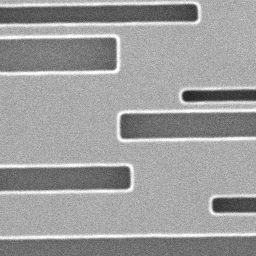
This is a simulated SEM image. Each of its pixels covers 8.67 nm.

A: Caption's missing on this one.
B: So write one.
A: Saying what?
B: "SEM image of groups of lines, slits or small figures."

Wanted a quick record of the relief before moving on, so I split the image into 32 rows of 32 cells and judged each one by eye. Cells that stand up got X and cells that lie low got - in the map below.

XXXXXXXXXXXXXXXXXXX-----XXXXXXXX
-------------------------XXXXXXX
-------------------------XXXXXXX
XXXXXXXXXXXXXXXXXXXXXXXXXXXXXXXX
XXXXXXXXXXXXXXXXXXXXXXXXXXXXXXXX
---------------XXXXXXXXXXXXXXXXX
---------------XXXXXXXXXXXXXXXXX
---------------XXXXXXXXXXXXXXXXX
---------------XXXXXXXXXXXXXXXXX
XXXXXXXXXXXXXXXXXXXXXXXXXXXXXXXX
XXXXXXXXXXXXXXXXXXXXXXXXXXXXXXXX
XXXXXXXXXXXXXXXXXXXXXXX---------
XXXXXXXXXXXXXXXXXXXXXXX---------
XXXXXXXXXXXXXXXXXXXXXXXXXXXXXXXX
XXXXXXXXXXXXXXX-----------------
XXXXXXXXXXXXXXX-----------------
XXXXXXXXXXXXXXX-----------------
XXXXXXXXXXXXXXXXXXXXXXXXXXXXXXXX
XXXXXXXXXXXXXXXXXXXXXXXXXXXXXXXX
XXXXXXXXXXXXXXXXXXXXXXXXXXXXXXXX
XXXXXXXXXXXXXXXXXXXXXXXXXXXXXXXX
----------------XXXXXXXXXXXXXXXX
----------------XXXXXXXXXXXXXXXX
----------------XXXXXXXXXXXXXXXX
XXXXXXXXXXXXXXXXXXXXXXXXXXXXXXXX
XXXXXXXXXXXXXXXXXXXXXXXXXX------
XXXXXXXXXXXXXXXXXXXXXXXXXXX-----
XXXXXXXXXXXXXXXXXXXXXXXXXXXXXXXX
XXXXXXXXXXXXXXXXXXXXXXXXXXXXXXXX
XXXXXXXXXXXXXXXXXXX-XXX---------
--------------------------------
--------------------------------